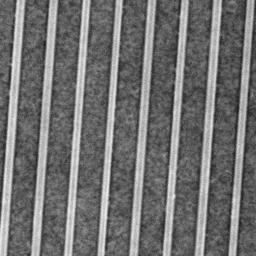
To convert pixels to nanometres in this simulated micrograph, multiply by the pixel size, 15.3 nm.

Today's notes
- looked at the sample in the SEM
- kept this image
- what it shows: parallel lines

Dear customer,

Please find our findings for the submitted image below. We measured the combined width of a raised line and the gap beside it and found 502 nm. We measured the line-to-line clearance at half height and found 403 nanometres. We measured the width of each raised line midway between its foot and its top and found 97.4 nm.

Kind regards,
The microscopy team